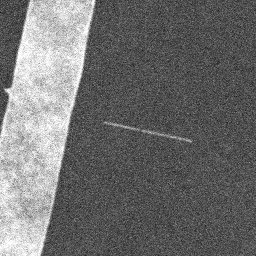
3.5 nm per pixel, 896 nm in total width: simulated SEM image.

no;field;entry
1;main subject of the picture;one or a few lines or trenches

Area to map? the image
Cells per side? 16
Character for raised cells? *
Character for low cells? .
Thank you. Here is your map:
..****..........
..****..........
.****...........
.****...........
.****...........
.****...........
.****...........
****............
****............
****............
****............
****............
***.............
***.............
***.............
***.............